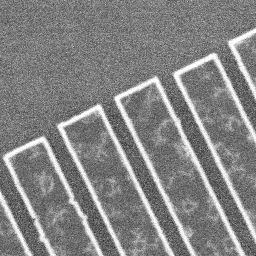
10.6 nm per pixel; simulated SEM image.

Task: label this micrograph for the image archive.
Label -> parallel lines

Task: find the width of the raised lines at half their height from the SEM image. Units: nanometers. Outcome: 469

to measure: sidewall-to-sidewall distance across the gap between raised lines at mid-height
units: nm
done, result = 206